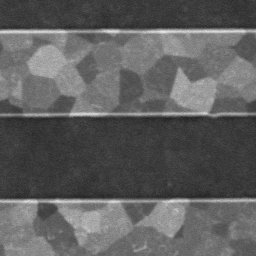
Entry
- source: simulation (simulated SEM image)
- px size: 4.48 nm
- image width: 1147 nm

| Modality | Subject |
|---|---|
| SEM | one or a few lines or trenches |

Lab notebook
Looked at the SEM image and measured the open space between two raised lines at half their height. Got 390 nanometres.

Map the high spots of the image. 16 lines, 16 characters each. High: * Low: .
................
................
****************
****************
****************
****************
****************
................
................
................
................
................
................
****************
****************
****************